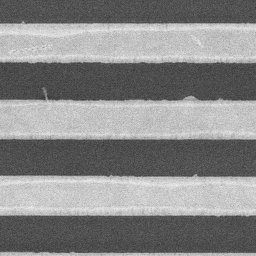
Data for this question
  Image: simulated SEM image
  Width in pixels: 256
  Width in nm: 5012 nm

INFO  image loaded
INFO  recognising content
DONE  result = lines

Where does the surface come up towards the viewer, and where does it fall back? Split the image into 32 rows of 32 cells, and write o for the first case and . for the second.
................................
................................
................................
...........ooooooooooooooooooooo
oooooooooooooooooooooooooooooooo
oooooooooooooooooooooooooooooooo
oooooooooooooooooooooooooooooooo
................................
................................
................................
................................
................................
................................
oooooooooooooooooooooooooooooooo
oooooooooooooooooooooooooooooooo
oooooooooooooooooooooooooooooooo
oooooooooooooooooooooooooooooooo
................................
................................
................................
................................
................................
...oooooooooooo.................
oooooooooooooooooooooooooooooooo
oooooooooooooooooooooooooooooooo
oooooooooooooooooooooooooooooooo
........ooo..o.........ooooooooo
................................
................................
................................
................................
................................